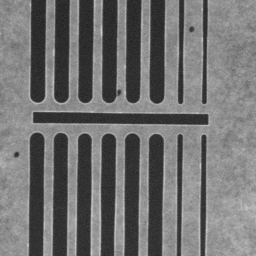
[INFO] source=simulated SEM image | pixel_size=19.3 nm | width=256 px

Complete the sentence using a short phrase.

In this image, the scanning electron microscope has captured groups of lines, slits or small figures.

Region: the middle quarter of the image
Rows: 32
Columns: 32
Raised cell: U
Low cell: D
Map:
DUUUDDDUUDDDDUUDDDDUUDDDDUUUDDUU
DUUUDDDUUDDDDUUDDDDUUDDDDUUUDDUU
DUUUDDDUUDDDDUUDDDDUUDDDDUUUDDUU
DUUDDDDUUDDDDUUDDDDUUDDDDUUUDDUU
DUUDDDDUUDDDDUUDDDDUUDDDDUUUDDUU
DUUDDDDUUDDDDUUDDDDUUDDDDUUUDDUU
DDUDDDDUUDDDDUUDDDDUUDDDDUUUDDUU
DDUDDDDUUDDDDUUDDDDUUDDDDUUUDDUU
DUUDDDDUUDDDDUUDDDDUUDDDDUUUDDUU
DUUUDDUUUUDDUUUUDDUUUUDDUUUUDDUU
UUUUUUUUUUUUUUUUUUUUUUUUUUUUUUUU
UUUUUUUUUUUUUUUUUUUUUUUUUUUUUUUU
DDDDDDDDDDDDDDDDDDDDDDDDDDDDDDDD
DDDDDDDDDDDDDDDDDDDDDDDDDDDDDDDD
DDDDDDDDDDDDDDDDDDDDDDDDDDDDDDDD
UUUUUUUUUUUUUUUUUUUUUUUUUUUUUUUU
UUUUUUUUUUUUUUUUUUUUUUUUUUUUUUUU
UUUUDDUUUUDDUUUUDDUUUUUDUUUUUUUU
DUUUDDDUUDDDDUUDDDDUUDDDDUUUDDUU
DUUDDDDUUDDDDUUDDDDUUDDDDUUUDDUU
DUUDDDDUUDDDDUUDDDDUUDDDDUUUDDUU
DUUDDDDUUDDDDUUDDDDUUDDDDUUUDDUU
DUUDDDDUUDDDDUUDDDDUUDDDDUUUDDUU
DUUDDDDUUDDDDUUDDDDUUDDDDUUUDDUU
DUUDDDDUUDDDDUUDDDDUUDDDDUUUDDUU
DUUDDDDUUDDDDUUDDDDUUDDDDUUUDDUU
DUUDDDDUUDDDDUUDDDDUUDDDDUUUDDUU
DUUDDDDUUDDDDUUDDDDUUDDDDUUUDDUU
DUUDDDDUUDDDDUUDDDDUUDDDDUUUDDUU
DUUDDDDUUDDDDUUDDDDUUDDDDUUUDDUU
DUUDDDDUUDDDDUUDDDDUUDDDDUUUDDUU
DUUDDDDUUDDDDUUDDDDUUDDDDUUUDDUU